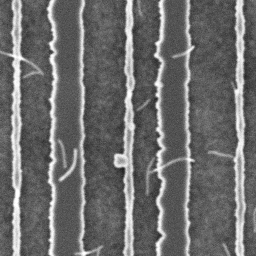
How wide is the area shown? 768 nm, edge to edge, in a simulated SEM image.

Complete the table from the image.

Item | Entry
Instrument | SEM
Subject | lines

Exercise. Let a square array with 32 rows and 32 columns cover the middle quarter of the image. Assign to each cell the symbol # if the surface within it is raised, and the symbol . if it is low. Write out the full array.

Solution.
#####..........##.......#######.
#####..........##.......#######.
#####..........##.......#######.
#####...........#......########.
#####...........##.....########.
#####...........#......########.
#####...........#......########.
#####...........#......########.
#####..........##.......#######.
#####..........##......########.
#####..........##......########.
#####...........#......########.
#####..........##......########.
#####..........##......########.
#####..........##.......#######.
#####..........###......#######.
#####..........##......########.
#####..........##.......#######.
#####..........##.......#######.
#####..........##.......#######.
#####..........##.......#######.
#####..........##.......#######.
#####..........##......########.
#####........####.......#######.
#####........####......########.
#####........####......#########
#####..........##......########.
#####..........##.......#######.
#####..........##.......#######.
#####..........##........######.
#####..........##.......#######.
#####..........###......#######.